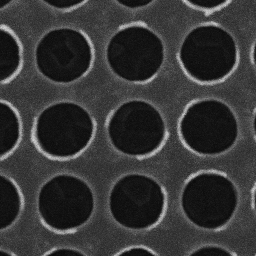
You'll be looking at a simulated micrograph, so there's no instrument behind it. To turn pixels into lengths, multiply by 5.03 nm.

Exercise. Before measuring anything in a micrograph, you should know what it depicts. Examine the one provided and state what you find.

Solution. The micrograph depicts a regular array of holes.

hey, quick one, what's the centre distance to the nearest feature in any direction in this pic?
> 0.362 micrometres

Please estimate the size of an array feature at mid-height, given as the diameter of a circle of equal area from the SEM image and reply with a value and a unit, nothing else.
276 nm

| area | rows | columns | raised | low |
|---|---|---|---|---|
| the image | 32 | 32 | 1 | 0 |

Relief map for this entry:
01111100001111100011111100001111
11111111111111111111111111111111
11111111111111111111111111111111
11111111111111110011111110001111
01111100001111000000111000000111
00111000000111000000111000000111
00111000000110000000111000000011
00110000000110000000111000000111
00111000000111000000111000000111
01111100001111100001111100001111
11111111111111111111111111111111
11111111111111111111111111111111
11111111111111111111111111111111
01111100001111100001111100000111
00111000000111000000111000000111
00111000000111000000111000000011
00111000000111000000111000000011
00111000000111000000111000000111
01111000001111100000111100000111
11111110111111111111111111111111
11111111111111111111111111111111
11111111111111111111111111111111
01111100001111100001111100000111
00111000000111000000111000000111
00111000000011000000111000000011
00011000000011000000111000000011
00111000000111000000111000000111
00111100000111000000111100000111
11111110011111110011111111011111
11111111111111111111111111111111
11111111111111111111111111111111
01111110001111100001111100001111